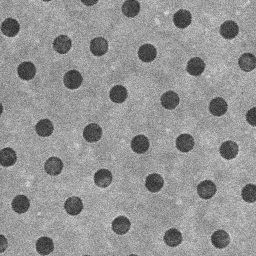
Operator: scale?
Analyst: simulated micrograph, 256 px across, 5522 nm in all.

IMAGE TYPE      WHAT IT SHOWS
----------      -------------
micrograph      a regular array of holes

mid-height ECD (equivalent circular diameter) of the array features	428	nanometers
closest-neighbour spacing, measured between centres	959	nm